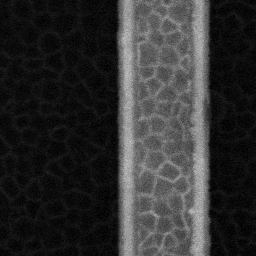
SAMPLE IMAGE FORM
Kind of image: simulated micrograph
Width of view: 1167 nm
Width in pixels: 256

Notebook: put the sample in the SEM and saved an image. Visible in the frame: one or a few lines or trenches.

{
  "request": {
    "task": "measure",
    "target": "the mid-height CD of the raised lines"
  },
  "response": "0.327 um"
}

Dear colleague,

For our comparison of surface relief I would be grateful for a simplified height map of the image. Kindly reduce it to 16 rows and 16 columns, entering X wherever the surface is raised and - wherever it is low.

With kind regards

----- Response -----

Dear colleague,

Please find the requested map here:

--------XXXX----
--------XXXX----
--------XXXX----
--------XXXX----
--------XXXX----
--------XXXXX---
--------XXXXX---
--------XXXX----
--------XXXX----
--------XXXX----
--------XXXX----
--------XXXX----
--------XXXX----
--------XXXX----
--------XXXX----
--------XXXX----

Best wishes